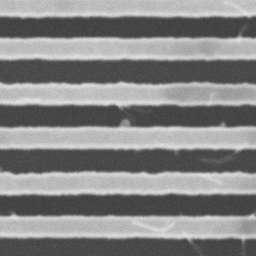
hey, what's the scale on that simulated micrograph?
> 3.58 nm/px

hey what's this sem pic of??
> lines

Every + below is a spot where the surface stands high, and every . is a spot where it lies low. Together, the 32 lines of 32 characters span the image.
++++++++++++++++++++++++++++++++
++++++++++++++++++++++++++++++++
................................
................................
................................
++++++++++++++++++++++++++++++++
++++++++++++++++++++++++++++++++
.....................+..........
................................
................................
+.+++++++.++.++++....++++++...+.
++++++++++++++++++++++++++++++++
++++++++++++++++++++++++++++++++
................................
................................
................................
++++++++++++++++++++++++++++++++
++++++++++++++++++++++++++++++++
++++++++++++++++++++++++++++++++
................................
................................
..........++....................
++++++++++++++++++++++++++++++++
++++++++++++++++++++++++++++++++
................................
................................
................................
++++++++++++++++++++++++++++++++
++++++++++++++++++++++++++++++++
++++++++++++++++++++++++++++++++
................................
................................